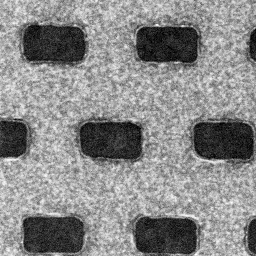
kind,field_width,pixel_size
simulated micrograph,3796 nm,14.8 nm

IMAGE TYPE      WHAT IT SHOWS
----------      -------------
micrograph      raised bodies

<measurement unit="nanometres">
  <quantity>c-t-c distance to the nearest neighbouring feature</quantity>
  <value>1650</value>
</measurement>